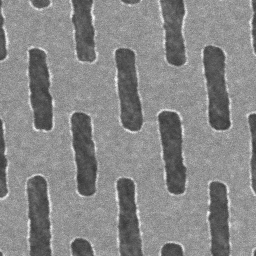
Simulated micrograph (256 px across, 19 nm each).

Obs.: holes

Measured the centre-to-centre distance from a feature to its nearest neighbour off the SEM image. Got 1460 nanometres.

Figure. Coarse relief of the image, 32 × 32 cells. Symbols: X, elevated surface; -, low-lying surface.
XXXX--XXX---XXXX-XXX---XXXXXXXX-
XXXXXXXXX--XXXXXXXXX---XXXXXXXXX
-XXXXXXXX---XXXXXXXX---XXXXXXXX-
XXXXXXXXX---XXXXXXXX---XXXXXXXX-
-XXXXXXXX---XXXXXXXXX--XXXXXXXX-
-XXXXXXXX---XXXXXXXXX--XXXXXXXXX
-XXX--XXX---XX---XXXX--XX---XXXX
XXXX--XXXX--XX---XXXX--XX---XXXX
XXXX--XXXXXXXXX--XXXXXXXX---XXXX
XXXX--XXXXXXXXX--XXXXXXXXX--XXXX
XXXX--XXXXXXXXX--XXXXXXXXX--XXXX
XXXX--XXXXXXXXX--XXXXXXXXX--XXXX
XXXX---XXXXXXXX---XXXXXXXX---XXX
XXXX---XXXXXXXX---XXXXXXXX---XXX
XXXX---XX--XXXX---XX--XXXX---XX-
XXXX---XX--XXXX---XX---XXX---XX-
XXXXXXXXX---XXXXXXXX---XXXXXXXX-
-XXXXXXXX---XXXXXXXX---XXXXXXXX-
-XXXXXXXX---XXXXXXXX---XXXXXXXX-
-XXXXXXXX---XXXXXXXX---XXXXXXXX-
-XXXXXXXX---XXXXXXXXX--XXXXXXXX-
-XXXXXXXXX--XXXXXXXXX--XXXXXXXX-
-XXX--XXXX--XXX-XXXXX--XXXXXXXX-
-XX---XXXX--XXX--XXXX--XXX--XXX-
-XX---XXXX-XXXX--XXXXXXXXX---XXX
XXXX--XXXXXXXXX--XXXXXXXXX---XXX
XXXX--XXXXXXXXX--XXXXXXXXX---XXX
XXXX--XXXXXXXXX--XXXXXXXXX---XXX
XXXX--XXXXXXXXX--XXXXXXXXX---XXX
XXXX--XXXXXXXXX---XXXXXXXX---XXX
XXXX--XXX--XXXX---XXX-XXXX---XXX
XXXX---XX---XXX---XX---XXX---XXX